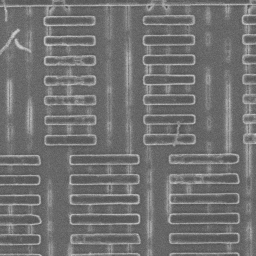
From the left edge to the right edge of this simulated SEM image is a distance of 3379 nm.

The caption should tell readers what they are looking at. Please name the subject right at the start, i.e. wiring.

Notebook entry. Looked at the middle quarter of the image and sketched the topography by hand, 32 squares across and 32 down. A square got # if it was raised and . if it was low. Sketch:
................................
................................
................................
########............############
########............############
................................
................................
................................
########............############
########............############
................................
................................
................................
########............############
########............############
................................
................................
............................#...
########............############
########............############
................................
................................
................................
..#################.......######
..#################.......######
................................
................................
................................
..#################.......######
..#################.......######
................................
................................